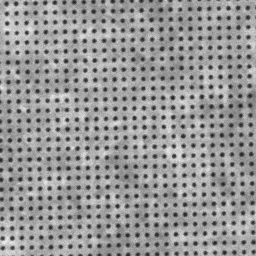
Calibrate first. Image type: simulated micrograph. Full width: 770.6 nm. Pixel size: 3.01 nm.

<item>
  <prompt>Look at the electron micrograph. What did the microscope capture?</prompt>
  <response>a regular array of holes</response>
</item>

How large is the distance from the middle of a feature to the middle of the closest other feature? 28.4 nanometers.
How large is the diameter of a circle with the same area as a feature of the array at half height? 14.8 nanometres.